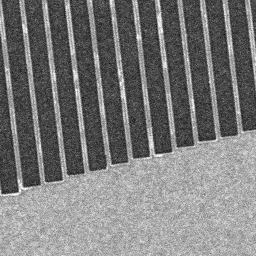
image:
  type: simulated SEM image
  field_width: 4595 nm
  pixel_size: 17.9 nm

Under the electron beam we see parallel lines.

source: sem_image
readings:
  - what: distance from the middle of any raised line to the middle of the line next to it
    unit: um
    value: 0.403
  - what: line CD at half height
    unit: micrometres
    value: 0.0758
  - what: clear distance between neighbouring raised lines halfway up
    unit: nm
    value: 332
